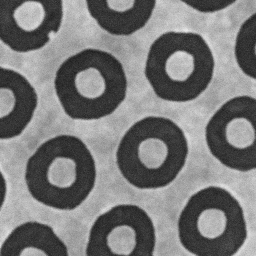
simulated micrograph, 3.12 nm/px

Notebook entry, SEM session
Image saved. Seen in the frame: ring-shaped grooves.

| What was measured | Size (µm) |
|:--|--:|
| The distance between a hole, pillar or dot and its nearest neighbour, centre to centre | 0.283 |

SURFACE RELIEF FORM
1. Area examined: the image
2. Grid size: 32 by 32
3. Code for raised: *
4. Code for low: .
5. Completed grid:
...**...***...***..****......***
..***...***........******..*****
..***...****.......************.
...*...******.....************..
.......*************.....*****..
*.....*************.......***...
**.*******...******...*...***...
********.......***...***...**...
.******........***...***...***..
...****...***...**...***...****.
....***..****...***.......******
*....**...***...***......*******
**...**........******...*****...
**...***.......************.....
....*****....******.*******.....
....*************.....****...**.
...*************.......***..****
******....*****...**...***..****
*****......****..****...**......
****........**...****..****.....
***....**...***...**...*****....
***...***...***........*********
.**...***...****......**********
.**.........*****...******..****
.***.......*************.....***
*****.....*************.......**
*************.....*****..***..**
************.......***...***...*
**....*****....*...***...***...*
*......****...***..***....*....*
........***...***..****.......**
...**...***...**...****.......**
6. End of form